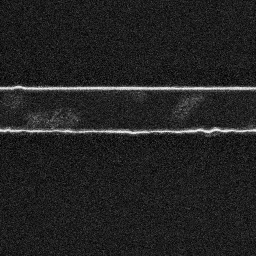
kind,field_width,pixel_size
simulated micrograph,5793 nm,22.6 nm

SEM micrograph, one or a few lines or trenches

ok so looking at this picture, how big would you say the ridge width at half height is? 42.9 pixels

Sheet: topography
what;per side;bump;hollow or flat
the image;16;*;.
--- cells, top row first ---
................
................
................
................
................
**..............
****************
****************
................
................
................
................
................
................
................
................